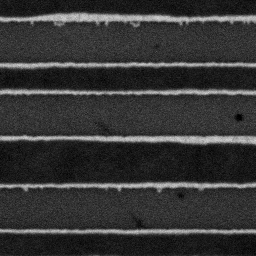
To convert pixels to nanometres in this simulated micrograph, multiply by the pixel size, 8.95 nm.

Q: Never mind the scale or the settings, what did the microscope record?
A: lines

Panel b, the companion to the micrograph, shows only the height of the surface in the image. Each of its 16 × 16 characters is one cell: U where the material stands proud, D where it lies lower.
UUUUUUUUUUUUUUUU
DDDDDDDDDDDDDDDD
DDDDDDDDDDDDDDDD
DDDDDDDDDDDDDDDD
UUUUUUUUUUUUUUUU
UUUUUUUUUUUUUUUU
DDDDDDDDDDDDDDDD
DDDDDDDDDDDDDDDD
DDDDDDDDDDDDDDDD
UUUUUUUUUUUUUUUU
UUUUUUUUUUUUUUUU
UUUUUUUUUUUUUUUU
DDDDDDDDDDDDDDDD
DDDDDDDDDDDDDDDD
UUUUUUUUUUUUUUUU
UUUUUUUUUUUUUUUU